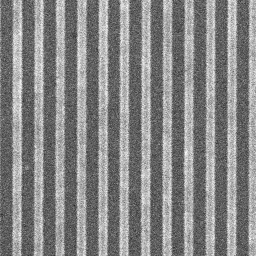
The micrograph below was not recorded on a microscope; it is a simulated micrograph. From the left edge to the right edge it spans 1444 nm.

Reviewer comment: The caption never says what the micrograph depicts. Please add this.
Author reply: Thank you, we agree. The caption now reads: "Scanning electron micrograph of parallel lines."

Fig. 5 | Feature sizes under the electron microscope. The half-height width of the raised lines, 40.9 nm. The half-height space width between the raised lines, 13.6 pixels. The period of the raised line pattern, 121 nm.